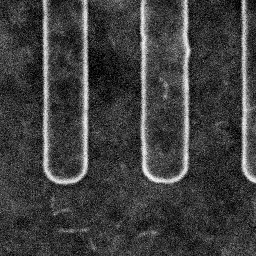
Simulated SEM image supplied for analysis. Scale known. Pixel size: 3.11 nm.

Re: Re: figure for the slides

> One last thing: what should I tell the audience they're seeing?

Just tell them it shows one or a few lines or trenches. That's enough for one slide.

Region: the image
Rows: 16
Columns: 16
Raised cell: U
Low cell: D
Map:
DDDUUDDDDUUUDDDU
DDDUUDDDDUUUDDDU
DDDUUDDDDUUUDDDU
DDDUUDDDDUUUDDDU
DDDUUDDDDUUUDDDU
DDDUUDDDDUUUDDDU
DDDUUDDDDUUUDDDU
DDDUUDDDDUUUDDDU
DDDUUDDDDUUUDDDU
DDDUUDDDDUUUDDDU
DDDUUDDDDUUUDDDU
DDDDDDDDDDDDDDDD
DDDDDDDDDDDDDDDD
DDDDDDDDDDDDDDDD
DDDDDDDDDDDDDDDD
DDDDDDDDDDDDDDDD